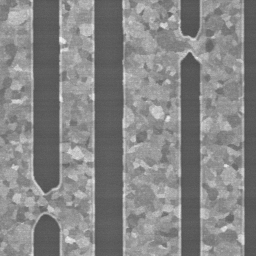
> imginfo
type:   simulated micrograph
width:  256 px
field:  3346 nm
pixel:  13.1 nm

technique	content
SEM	one or a few lines or trenches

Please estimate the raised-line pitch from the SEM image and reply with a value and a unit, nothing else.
942 nm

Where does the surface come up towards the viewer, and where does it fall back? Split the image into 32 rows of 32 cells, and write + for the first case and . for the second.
++++....++++...+++++++...+++++..
++++....++++....++++++...+++++..
++++....++++....++++++...+++++..
++++....++++....++++++...+++++..
++++....++++....+++++++..+++++..
++++....++++....++++++++++++++..
++++....++++....++++++++++++++..
++++....++++...++++++++..+++++..
++++....++++...+++++++...+++++..
++++....++++....++++++...+++++..
++++....++++....++++++...+++++..
++++....++++....++++++...+++++..
++++....++++....++++++...+++++..
++++....++++....++++++...+++++..
++++....++++...+++++++...+++++..
++++....++++...+++++++...+++++..
++++....++++...+++++++...+++++..
++++....++++....++++++...+++++..
++++....++++....++++++...+++++..
++++....++++....++++++...+++++..
++++....++++...+++++++...+++++..
++++....++++....++++++...+++++..
++++....++++....++++++...+++++..
+++++..+++++....++++++...+++++..
++++++++++++....++++++...+++++..
++++++++++++....++++++...+++++..
++++++++++++....++++++...+++++..
+++++..+++++....++++++...+++++..
++++....++++....++++++...+++++..
++++....++++....++++++...+++++..
++++....++++....++++++...+++++..
++++....++++....++++++...+++++..